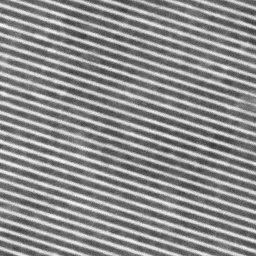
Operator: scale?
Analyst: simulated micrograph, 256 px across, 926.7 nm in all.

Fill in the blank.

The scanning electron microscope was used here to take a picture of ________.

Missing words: parallel lines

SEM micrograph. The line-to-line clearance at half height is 25.5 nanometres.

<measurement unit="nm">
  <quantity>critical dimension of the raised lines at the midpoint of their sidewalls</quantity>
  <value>8.6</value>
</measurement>